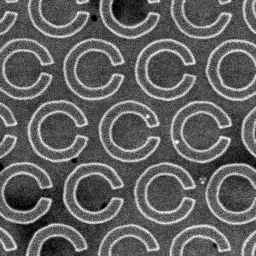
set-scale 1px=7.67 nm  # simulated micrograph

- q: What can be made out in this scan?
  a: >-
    an array of small figures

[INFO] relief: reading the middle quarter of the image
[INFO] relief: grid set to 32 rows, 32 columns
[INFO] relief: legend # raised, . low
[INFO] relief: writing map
###...............###...........
###...............###...........
###...............###...........
###.........###...###.........##
.###.......###....####.......###
.####.....####.....####.....####
..###########.......###########.
...#########.........#########..
.....#####.............#####....
#..............###..............
###.........########..........##
####.......###########.......###
.####.....#####...#####.....####
..###.....###.......###....####.
...###...####........###...###..
...#.....###.........##....###..
.........###...............##...
.........###...............##...
...###...###.........##....###..
...###...###.........###...###..
..###.....###.......###.....###.
####.......####...#####.....####
####.......###########.......###
##...........#######...........#
................................
....#######...........######....
...#########.........#########..
..#####.#####.......###########.
.###......####.....####.....####
####.......####...####.......###
###.........###...###.........##
###...............###...........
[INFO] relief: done